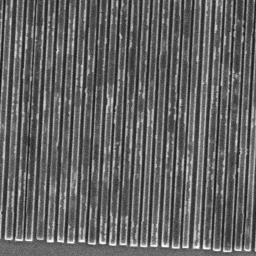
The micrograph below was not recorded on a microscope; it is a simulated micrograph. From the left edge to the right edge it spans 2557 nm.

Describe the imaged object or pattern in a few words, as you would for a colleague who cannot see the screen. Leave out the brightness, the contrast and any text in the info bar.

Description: parallel lines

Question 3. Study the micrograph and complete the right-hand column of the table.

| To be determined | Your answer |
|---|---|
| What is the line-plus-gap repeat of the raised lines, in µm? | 0.104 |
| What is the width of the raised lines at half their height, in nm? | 66.1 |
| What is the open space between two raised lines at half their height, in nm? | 37.4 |